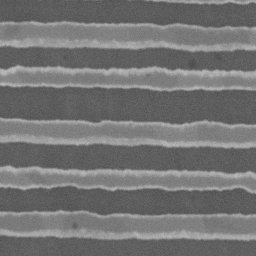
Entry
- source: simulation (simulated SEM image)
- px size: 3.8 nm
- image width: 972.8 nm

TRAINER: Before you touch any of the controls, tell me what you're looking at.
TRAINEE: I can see lines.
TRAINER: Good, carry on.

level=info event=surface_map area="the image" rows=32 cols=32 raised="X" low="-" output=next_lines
--------------------------------
--------------------------------
--------------------------------
XXXXXXXXXXXXXXXXXXXXXXXXXX--XXXX
XXXXXXXXXXXXXXXXXXXXXXXXXXXXXXXX
--X-----XX-XXXXXXXXXXXXXXXXXXXXX
--------------------------------
--------------------------------
--X-----------------------------
XXXXXXXXXXXXXXXXXXXXXXXXXXXXXXXX
XXXXXXXXXXXXXXXXXXXXXXXXXXXXXXXX
--------------------------------
--------------------------------
--------------------------------
--------------------------------
XXXXXXXXXXXXXXXXXXXXX--XXXXX----
XXXXXXXXXXXXXXXXXXXXXXXXXXXXXXXX
----XXXXXXXXXXXXXXXXXXXXXXXXXXXX
--------------------------------
--------------------------------
--------------------------------
XXXXXXXXXX--XXX-X---------------
XXXXXXXXXXXXXXXXXXXXXXXXXXXXXXXX
--XX---------XXXXX--XXXXXXXXX-XX
--------------------------------
--------------------------------
----X--XXXX---------------------
XXXXXXXXXXXXXXXXXXXXXXXXXXXXXXXX
XXXXXXXXXXXXXXXXXXXXXXXXXXXXXXXX
--------------XX-XXX----XXXXXXXX
--------------------------------
--------------------------------